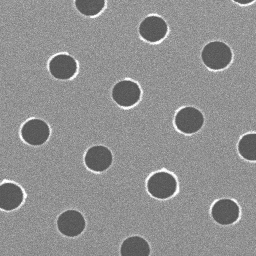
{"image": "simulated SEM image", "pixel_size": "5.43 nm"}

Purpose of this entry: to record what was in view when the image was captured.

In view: a regular array of holes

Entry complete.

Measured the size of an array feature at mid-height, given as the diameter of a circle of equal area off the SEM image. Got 148 nanometers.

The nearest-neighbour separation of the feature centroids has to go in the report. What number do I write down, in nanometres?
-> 373